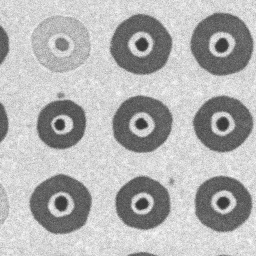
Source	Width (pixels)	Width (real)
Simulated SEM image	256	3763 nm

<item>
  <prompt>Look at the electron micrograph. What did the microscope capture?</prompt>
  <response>a regular array of ring-shaped grooves with a dot in the middle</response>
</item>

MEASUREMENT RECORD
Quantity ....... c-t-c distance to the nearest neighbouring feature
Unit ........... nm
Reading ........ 1170